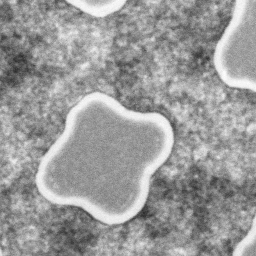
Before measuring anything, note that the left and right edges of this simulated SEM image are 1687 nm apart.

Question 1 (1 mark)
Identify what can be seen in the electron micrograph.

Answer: raised bodies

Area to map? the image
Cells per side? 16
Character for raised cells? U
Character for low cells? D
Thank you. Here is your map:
DDDDDUUDDDDDDDDU
DDDDDDDDDDDDDDDU
DDDDDDDDDDDDDDUU
DDDDDDDDDDDDDDUU
DDDDDDDDDDDDDDUU
DDDDDDDDDDDDDDDD
DDDDDUUDDDDDDDDD
DDDDUUUUUUDDDDDD
DDDDUUUUUUUDDDDD
DDDUUUUUUUDDDDDD
DDDUUUUUUUDDDDDD
DDUUUUUUUDDDDDDD
DDDUUUUUUDDDDDDD
DDDDDDUUDDDDDDDD
DDDDDDDDDDDDDDDD
DDDDDDDDDDDDDDDU